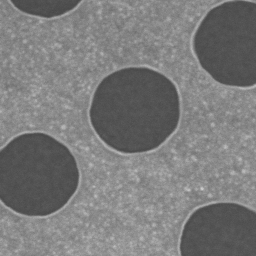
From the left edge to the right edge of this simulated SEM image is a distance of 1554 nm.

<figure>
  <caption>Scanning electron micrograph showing holes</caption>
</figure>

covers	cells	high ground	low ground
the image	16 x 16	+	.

+....++++++++...
+++++++++++++...
++++++++++++....
++++++++++++....
+++++++...+++...
++++++.....+++++
++++++.....+++++
++++++.....+++++
+..+++.....+++++
....++++.+++++++
.....+++++++++++
.....+++++++++++
....++++++++++++
++++++++++++....
+++++++++++.....
+++++++++++.....